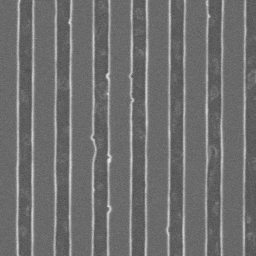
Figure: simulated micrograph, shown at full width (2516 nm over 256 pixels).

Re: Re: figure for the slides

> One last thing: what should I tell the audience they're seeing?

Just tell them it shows parallel lines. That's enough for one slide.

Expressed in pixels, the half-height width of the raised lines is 23.8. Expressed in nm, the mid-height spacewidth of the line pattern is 140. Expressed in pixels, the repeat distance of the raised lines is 37.8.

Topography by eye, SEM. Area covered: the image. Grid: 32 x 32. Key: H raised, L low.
HHLLHHHLLHHHLLHHLLHHHLLHHHLLHHHL
HHLLHHHLLHHHLLHHLLHHHLLHHHLLHHHL
HHLLHHHLLHHHLLHHLLHHHLLHHHLLHHHL
HHLLHHHLLHHHLLHHLLHHHLLHHHLLHHHL
HHLLHHHLLHHHLLHHLLHHHLLHHHLLHHHL
HHLLHHHLLHHHLLHHLLHHHLLHHHLLHHHL
HHLLHHHLLHHHLLHHLLHHHLLHHHLLHHHL
HHLLHHHLLHHHLLHHLLHHHLLHHHLLHHHL
HHLLHHHLLHHHLLHHLLHHHLLHHHLLHHHL
HHLLHHHLLHHHLLHHLLHHHLLHHHLLHHHL
HHLLHHHLLHHHLLHHLLHHHLLHHHLLHHHL
HHLLHHHLLHHHLLHHLLHHHLLHHHLLHHHL
HHLLHHHLLHHHLLHHHLHHHLLHHHLLHHHL
HHLLHHHLLHHHLLHHLLHHHLLHHHLLHHHL
HHLLHHHLLHHHLLHHLLHHHLLHHHLLHHHL
HHLLHHHLLHHHLLHHLLHHHLLHHHLLHHHL
HHLLHHHLLHHHLLHHLLHHHLLHHHLLHHHL
HHLLHHHLLHHHLLHHLLHHHLLHHHLLHHHL
HHLLHHHLLHHHLLHHLLHHHLLHHHLLHHHL
HHLLHHHLLHHHLLHHLLHHHLLHHHLLHHHL
HHLLHHHLLHHHLLHHLLHHHLLHHHLLHHHL
HHLLHHHLLHHHLLHHLLHHHLLHHHLLHHHL
HHLLHHHLLHHHLLHHLLHHHLLHHHLLHHHL
HHLLHHHLLHHHLLHHLLHHHLLHHHLLHHHL
HHLLHHHLLHHHLLHHLLHHHLLHHHLLHHLL
HHLLHHHLLHHHLLHHLLHHHLLHHHLLHHLL
HHLLHHHLLHHHLLHHLLHHHLLHHHLLHHLL
HHLLHHHLLHHHLHHHLLHHHLLHHHLLHHLL
HHLLHHHLLHHHLHHHLLHHHLLHHHLLHHLL
HHLLHHHLLHHHLHHHLLHHHLLHHHLLHHLL
HHLLHHHLLHHHLHHHLLHHHLLHHHLLHHLL
HHLLHHHLLHHHLHHHLLHHHLLHHHLLHHLL